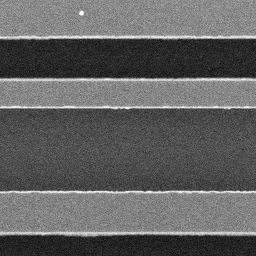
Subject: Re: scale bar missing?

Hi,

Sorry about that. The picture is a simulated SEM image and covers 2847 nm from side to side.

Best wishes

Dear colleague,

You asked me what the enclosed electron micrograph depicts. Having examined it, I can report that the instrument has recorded lines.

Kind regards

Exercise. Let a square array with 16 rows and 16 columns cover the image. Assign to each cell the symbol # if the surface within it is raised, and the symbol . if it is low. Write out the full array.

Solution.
################
################
................
................
................
################
################
................
................
................
................
................
################
################
################
................